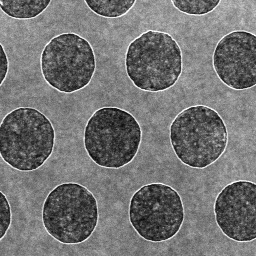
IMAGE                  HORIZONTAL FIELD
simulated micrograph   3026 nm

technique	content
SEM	holes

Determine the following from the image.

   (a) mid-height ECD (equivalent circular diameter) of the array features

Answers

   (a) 682 nm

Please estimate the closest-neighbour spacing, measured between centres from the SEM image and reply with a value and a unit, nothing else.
1020 nm